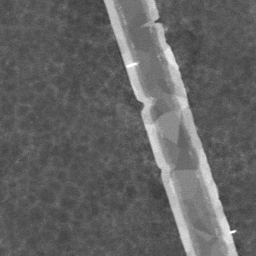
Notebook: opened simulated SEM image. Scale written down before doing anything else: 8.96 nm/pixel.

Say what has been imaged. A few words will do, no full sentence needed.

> one or a few lines or trenches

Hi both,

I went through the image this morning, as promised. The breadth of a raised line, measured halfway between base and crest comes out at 357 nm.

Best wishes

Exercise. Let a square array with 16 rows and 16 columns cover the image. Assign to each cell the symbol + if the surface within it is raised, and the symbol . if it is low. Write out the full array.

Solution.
.......+++......
.......+++......
........++......
........+++.....
........+++.....
.........++.....
.........++.....
.........+++....
..........++....
..........+++...
..........+++...
...........++...
...........++...
...........+++..
...........+++..
............++..